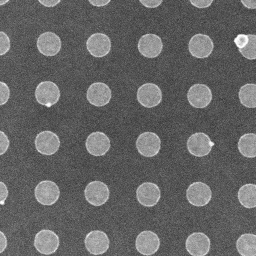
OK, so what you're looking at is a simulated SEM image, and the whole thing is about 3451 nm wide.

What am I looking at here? a regular array of raised bodies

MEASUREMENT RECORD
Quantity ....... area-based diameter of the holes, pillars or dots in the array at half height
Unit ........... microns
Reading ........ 0.321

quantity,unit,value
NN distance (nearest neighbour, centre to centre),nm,664